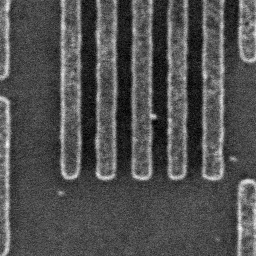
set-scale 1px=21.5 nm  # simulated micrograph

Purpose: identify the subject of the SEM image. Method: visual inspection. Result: wiring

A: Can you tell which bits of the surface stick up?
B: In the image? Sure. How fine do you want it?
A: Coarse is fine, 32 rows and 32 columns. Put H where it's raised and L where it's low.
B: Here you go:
HLLLLLLLHHLLHHLLLHHLLHHLLLHHLLHH
HLLLLLLLHHLLHHLLLHHLLHHLLLHHLLHH
HLLLLLLLHHLLHHLLLHHLLHHLLLHHLLHH
HLLLLLLLHHLLHHLLLHHLLHHLLLHHLLHH
HLLLLLLLHHLLHHLLLHHLLHHLLLHHLLHH
HLLLLLLLHHLLHHLLLHHLLHHLLLHHLLHH
HLLLLLLLHHLLHHLLLHHLLHHLLHHHLLHH
HLLLLLLLHHLLHHLLLHHLLHHLLHHHLLLH
HLLLLLLLHHLLHHLLLHHLLHHLLHHHLLLL
HLLLLLLLHHLLHHLLLHHLLHHLLHHHLLLL
LLLLLLLLHHLLHHLLLHHLLHHLLLHHLLLL
LLLLLLLLHHLLHHLLLHHLLHHLLLHHLLLL
HLLLLLLLHHLLHHLLLHHLLHHLLLHHLLLL
HLLLLLLLHHLLHHLLLHHLLHHLLHHHLLLL
HLLLLLLLHHLLHHLLLHHLLHHLLHHHLLLL
HLLLLLLLHHLLHHLLLHHLLHHLLHHHLLLL
HLLLLLLLHHLLHHLLLHHLLHHLLLHHLLLL
HLLLLLLLHHLLHHLLLHHLLHHLLHHHLLLL
HLLLLLLLHHLLHHLLLHHLLHHLLHHHLLLL
HLLLLLLLHHLLHHLLLHHLLHHLLHHHLLLL
HLLLLLLLHHLLHHLLLHHLLHHLLHHHLLLL
HLLLLLLLHHLLHHLLLHHLLHHLLHHHLLLL
HLLLLLLLLLLLLLLLLLLLLLLLLLLLLLLL
HLLLLLLLLLLLLLLLLLLLLLLLLLLLLLHH
HLLLLLLLLLLLLLLLLLLLLLLLLLLLLLHH
HLLLLLLLLLLLLLLLLLLLLLLLLLLLLLHH
HLLLLLLLLLLLLLLLLLLLLLLLLLLLLLHH
HLLLLLLLLLLLLLLLLLLLLLLLLLLLLLHH
HLLLLLLLLLLLLLLLLLLLLLLLLLLLLLHH
HLLLLLLLLLLLLLLLLLLLLLLLLLLLLLHH
HLLLLLLLLLLLLLLLLLLLLLLLLLLLLLHH
HLLLLLLLLLLLLLLLLLLLLLLLLLLLLLHH